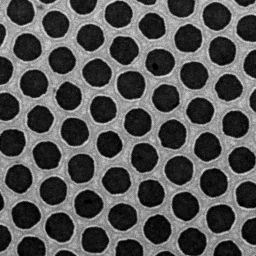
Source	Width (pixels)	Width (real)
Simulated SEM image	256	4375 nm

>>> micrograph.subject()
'a regular array of holes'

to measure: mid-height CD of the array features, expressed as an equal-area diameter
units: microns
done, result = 0.497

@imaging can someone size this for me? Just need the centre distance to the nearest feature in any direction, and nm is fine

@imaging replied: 618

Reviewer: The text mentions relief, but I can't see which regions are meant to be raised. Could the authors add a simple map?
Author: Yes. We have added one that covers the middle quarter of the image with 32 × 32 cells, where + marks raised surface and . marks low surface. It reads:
...++......+++++++++........++..
..++........+++++++++......++...
.+++........++.....+++....+++...
+++++.......+.......+++++++++...
..++++.....++.......+++++++++...
...++++...+++.......++++...+++..
....+++++++++.......++......++++
....++++++++++......++.......+++
.....++.....+++....+++.......+++
....+++......+++++++++.......++.
....++.......++++++++++.....+++.
..++++.......++++...+++....+++..
+++++++......+++.....++++++++++.
+..++++......++.......+++++++++.
.....+++...++++.......+++....+++
......+++++++++.......++......++
......+++++++++.......++.......+
......+++.....++.....++........+
......++......++++++++++.......+
.....+++.......+++++++++......++
++..++++.......+++....++......++
++++++++.......++......+++++++++
+++...+++.....+++.......++++++++
++.....++++.+++++.......+++....+
+.......+++++++++.......++......
+.......+++++++++......++.......
+.......+++.....++....+++.......
+......+++......+++++++++.......
+......++........+++++++++......
+++...+++........++.....+++....+
.+++++++++.......++......+++.+++
.++++..+++......++.......+++++++